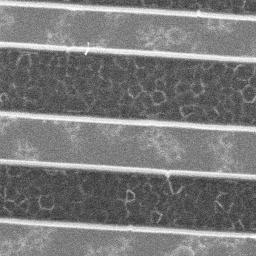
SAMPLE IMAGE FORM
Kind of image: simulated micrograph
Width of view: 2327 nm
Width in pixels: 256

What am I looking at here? one or a few lines or trenches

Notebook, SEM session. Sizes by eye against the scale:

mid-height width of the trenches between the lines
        63.8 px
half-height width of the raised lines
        0.41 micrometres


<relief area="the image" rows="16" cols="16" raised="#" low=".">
######..........
################
################
............####
................
................
................
######..........
################
################
.......#########
................
................
................
############....
################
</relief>